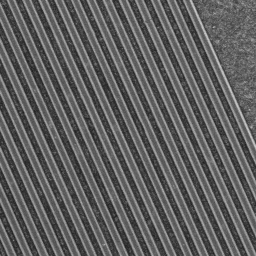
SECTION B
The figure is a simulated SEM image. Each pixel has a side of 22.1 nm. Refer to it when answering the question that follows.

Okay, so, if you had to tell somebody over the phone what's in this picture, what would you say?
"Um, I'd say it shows parallel lines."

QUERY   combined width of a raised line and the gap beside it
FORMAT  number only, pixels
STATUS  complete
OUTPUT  14.7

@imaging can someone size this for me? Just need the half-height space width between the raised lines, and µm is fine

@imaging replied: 0.192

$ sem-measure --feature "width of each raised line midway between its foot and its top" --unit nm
134